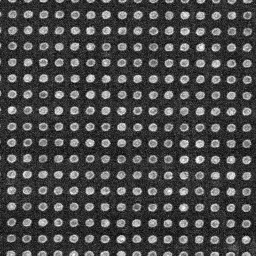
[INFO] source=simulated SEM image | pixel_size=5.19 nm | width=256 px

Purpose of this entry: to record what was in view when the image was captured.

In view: a regular array of raised bodies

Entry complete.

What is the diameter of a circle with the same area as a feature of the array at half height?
0.0402 micrometres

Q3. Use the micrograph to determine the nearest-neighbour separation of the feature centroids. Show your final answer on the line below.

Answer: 80.3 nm